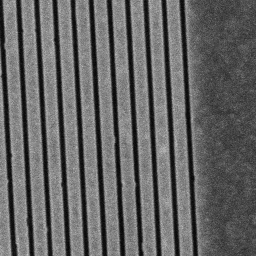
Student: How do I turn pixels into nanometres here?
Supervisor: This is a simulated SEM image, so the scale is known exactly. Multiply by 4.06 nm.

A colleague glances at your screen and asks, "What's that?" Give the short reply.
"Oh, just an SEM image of parallel lines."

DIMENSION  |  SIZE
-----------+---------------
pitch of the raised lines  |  73.7 nm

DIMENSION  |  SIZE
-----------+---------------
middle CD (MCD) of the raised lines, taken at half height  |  54.7 nanometers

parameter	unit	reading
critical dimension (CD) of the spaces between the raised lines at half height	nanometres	19.8